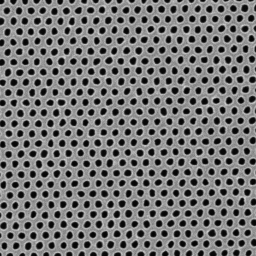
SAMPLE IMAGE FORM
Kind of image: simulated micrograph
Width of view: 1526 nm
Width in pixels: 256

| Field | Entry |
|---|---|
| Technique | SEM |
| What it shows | a regular array of holes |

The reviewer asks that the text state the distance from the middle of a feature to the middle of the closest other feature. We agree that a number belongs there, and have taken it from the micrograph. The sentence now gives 0.0676 um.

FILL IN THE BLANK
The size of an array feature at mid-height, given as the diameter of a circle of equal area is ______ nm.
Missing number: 39.8